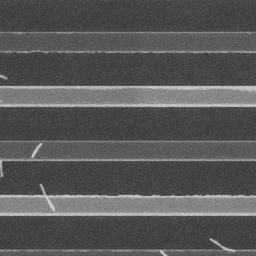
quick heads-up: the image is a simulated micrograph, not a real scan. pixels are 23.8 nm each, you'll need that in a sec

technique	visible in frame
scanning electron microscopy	lines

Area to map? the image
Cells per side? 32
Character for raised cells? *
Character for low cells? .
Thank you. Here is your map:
................................
................................
................................
................................
********************************
********************************
.............*....*.............
................................
................................
................................
................................
********************************
********************************
................................
................................
................................
................................
................................
********************************
********************************
................................
................................
................................
................................
*.****..*****.****..............
********************************
********************************
................................
................................
................................
................................
********************************